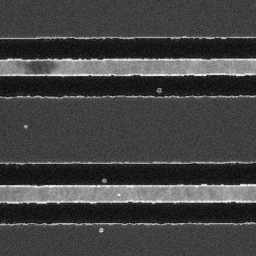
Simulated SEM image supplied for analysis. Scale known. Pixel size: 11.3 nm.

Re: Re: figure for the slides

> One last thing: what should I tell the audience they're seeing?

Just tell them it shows lines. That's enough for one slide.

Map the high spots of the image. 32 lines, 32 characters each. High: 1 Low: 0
11111111111111111111111111111111
11111111111111111111111111111111
11111111111111111111111111111111
11111111111111111111111111111111
11111111111111111111111111111111
00000000000000000000000000000000
00000000000000000000000000000000
01100110100101101101101111111111
11111111111111111111111111111111
00000000000000000000000000000000
00000000000000000000000000000000
00000000000000000000000000000000
11111111111111111111111111111111
11111111111111111111111111111111
11111111111111111111111111111111
11111111111111111111111111111111
11111111111111111111111111111111
11111111111111111111111111111111
11111111111111111111111111111111
11111111111111111111111111111111
00000000000000000000000000000000
00000000000000000000000000000000
00000000000000000000000000000000
11111111111111111111111111111111
11111111111111111111111111111111
00000000000000000000000000000000
00000000000000000000000000000000
00000000000000000000000000000000
11111111111111111111111111111111
11111111111111111111111111111111
11111111111111111111111111111111
11111111111111111111111111111111